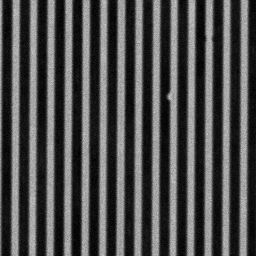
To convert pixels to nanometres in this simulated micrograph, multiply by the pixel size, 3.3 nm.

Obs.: parallel lines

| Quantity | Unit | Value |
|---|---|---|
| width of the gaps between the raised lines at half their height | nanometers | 31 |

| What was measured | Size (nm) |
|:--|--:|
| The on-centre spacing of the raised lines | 58.1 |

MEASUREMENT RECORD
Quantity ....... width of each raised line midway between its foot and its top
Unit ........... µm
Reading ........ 0.0281